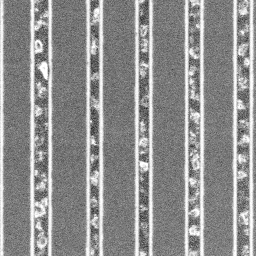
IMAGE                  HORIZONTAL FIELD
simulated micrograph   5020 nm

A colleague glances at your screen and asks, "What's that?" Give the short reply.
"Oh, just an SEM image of parallel lines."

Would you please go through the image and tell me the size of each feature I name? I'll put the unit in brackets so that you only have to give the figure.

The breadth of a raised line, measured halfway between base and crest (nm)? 699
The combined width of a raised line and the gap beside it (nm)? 990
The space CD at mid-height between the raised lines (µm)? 0.289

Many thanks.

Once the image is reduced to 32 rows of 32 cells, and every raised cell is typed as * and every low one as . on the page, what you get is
****..*****..****..****..****..*
****..*****..****..****..****..*
****..*****..****..****..****..*
****..*****..****..****..****..*
****..*****..****..****..****..*
****..*****..****..****..****..*
****..*****..****..****..****..*
****..*****..****..****..****..*
****..*****..****..****..****..*
****..*****..****..****..****..*
****..*****..****..****..****..*
****..*****..****..****..****..*
****..*****..****..****..****..*
****..*****..****..****..****..*
****..*****..****..****..****..*
****..*****..****..****..****..*
****..*****..****..****..****..*
****..*****..****..****..****..*
****..*****..****..****..****..*
****..*****..****..****..****..*
****..*****..****..****..****..*
****..*****..****..****..****..*
****..*****..****..****..****..*
****..*****..****..****..****..*
****..*****..****..****..****..*
****..*****..****..****..****..*
****..*****..****..****..****..*
****..*****..****..****..****..*
****..*****..****..****..****..*
****..*****..****..****..****..*
****..*****..****..****..****..*
****..*****..****..****..****..*